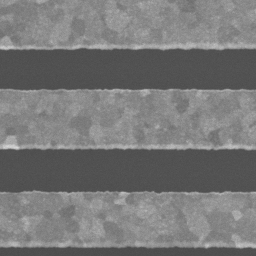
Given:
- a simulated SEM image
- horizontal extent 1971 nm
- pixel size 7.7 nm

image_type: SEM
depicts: lines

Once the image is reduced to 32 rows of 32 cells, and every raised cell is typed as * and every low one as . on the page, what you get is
********************************
********************************
********************************
********************************
********************************
********************************
................................
................................
................................
................................
................................
********************************
********************************
********************************
********************************
********************************
********************************
********************************
****.*********.*****************
................................
................................
................................
................................
................................
********************************
********************************
********************************
********************************
********************************
********************************
********************************
................................